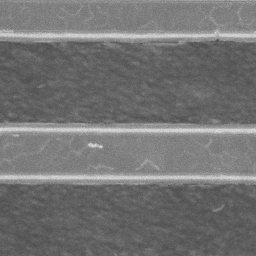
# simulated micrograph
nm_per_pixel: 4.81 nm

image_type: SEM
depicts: one or a few lines or trenches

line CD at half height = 227 nanometers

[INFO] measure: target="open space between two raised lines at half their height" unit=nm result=455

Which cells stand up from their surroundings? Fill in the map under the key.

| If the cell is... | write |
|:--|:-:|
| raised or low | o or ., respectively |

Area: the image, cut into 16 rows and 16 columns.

oooooooooooooooo
oooooooooooooooo
................
................
................
................
................
................
oooooooooooooooo
oooooooooooooooo
oooooooooooooooo
................
................
................
................
................